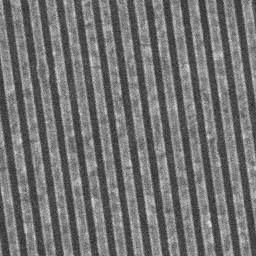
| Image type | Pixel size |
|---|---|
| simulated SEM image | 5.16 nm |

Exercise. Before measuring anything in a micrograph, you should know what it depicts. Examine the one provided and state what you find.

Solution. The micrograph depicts parallel lines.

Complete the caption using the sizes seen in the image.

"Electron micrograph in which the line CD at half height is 0.0409 microns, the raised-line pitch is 17.6 pixels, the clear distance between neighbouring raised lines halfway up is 0.0505 micrometres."